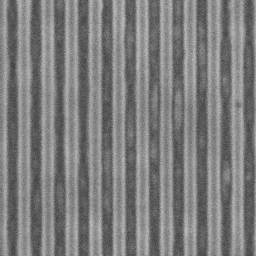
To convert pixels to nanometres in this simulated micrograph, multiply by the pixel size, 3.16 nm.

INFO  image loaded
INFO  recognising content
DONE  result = parallel lines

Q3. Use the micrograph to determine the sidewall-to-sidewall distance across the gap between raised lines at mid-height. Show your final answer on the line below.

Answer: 11.9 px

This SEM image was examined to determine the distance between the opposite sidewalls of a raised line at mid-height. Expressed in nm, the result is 37.1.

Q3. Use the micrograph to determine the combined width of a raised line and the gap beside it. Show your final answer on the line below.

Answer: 75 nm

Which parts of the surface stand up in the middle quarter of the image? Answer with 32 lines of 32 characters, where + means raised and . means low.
.++...+++...+++...+++...+++...++
.++...+++...+++...+++...+++...++
.++...+++...+++...+++...+++...++
.++...+++...+++...+++...+++...++
.++...+++...+++...+++...+++...++
.++...+++...+++...+++...+++...++
.++....++...+++...+++...+++...++
.++...+++...+++...+++...+++...++
.++...+++...+++...+++...+++.+.++
.++...+++...+++...+++...+++.+.++
.++...+++...+++...+++...+++...++
.++...+++...+++...+++...+++...++
.++...+++...+++...+++...+++...++
.++...+++...+++...+++...+++...++
.++...+++...+++...+++...+++...++
.++...+++...+++...+++...+++...++
.++...+++...+++...+++...+++...++
.++...+++...+++...+++...+++...++
.++...+++...+++...+++...+++...++
.++...+++...+++...+++...+++...++
.++...+++...+++...+++...+++...++
.++...+++...+++...+++...+++...++
.++...+++...+++...+++...+++...++
.++...+++...+++...+++...+++...++
.++...+++...+++...+++...+++...++
.++...+++...+++...+++...+++...++
.++...+++...+++...+++...+++...++
.++...+++...+++...+++...+++...++
.++....++...+++...+++...+++...++
.++....++...+++...+++...+++...++
.++....++...+++...+++...+++...++
.++....++...+++...+++...+++...++